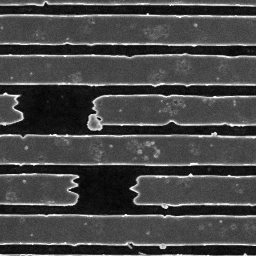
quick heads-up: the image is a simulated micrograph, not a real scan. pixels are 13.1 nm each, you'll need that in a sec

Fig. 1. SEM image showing parallel lines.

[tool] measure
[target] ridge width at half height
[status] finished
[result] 385 nm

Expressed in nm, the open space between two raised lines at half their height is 133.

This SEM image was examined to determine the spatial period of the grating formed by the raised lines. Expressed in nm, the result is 524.